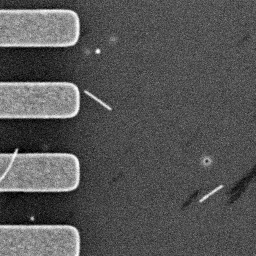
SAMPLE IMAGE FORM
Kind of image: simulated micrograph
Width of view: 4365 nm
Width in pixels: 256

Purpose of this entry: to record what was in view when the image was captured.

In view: wiring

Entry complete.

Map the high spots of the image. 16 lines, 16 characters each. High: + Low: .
................
+++++...........
+++++...........
................
................
+++++...........
+++++...........
................
................
................
+++++...........
+++++...........
................
................
+++++...........
+++++...........